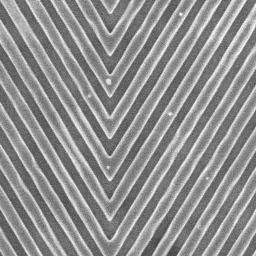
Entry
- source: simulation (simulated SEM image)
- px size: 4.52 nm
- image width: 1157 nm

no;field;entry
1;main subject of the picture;groups of lines, slits or small figures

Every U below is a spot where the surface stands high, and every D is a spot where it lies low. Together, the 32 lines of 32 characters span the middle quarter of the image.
UUUUDDUUUUDDDUUUDDDUUUUDDDUUUDDD
DUUUDDDUUUUDDUUUDDDUUUDDDUUUUDDU
DDUUUDDDUUUDUUUDDDUUUUDDDUUUDDDU
DDUUUUDDDUUUUUUDDDUUUDDDUUUDDDUU
DDDUUUDDDUUUUUDDDUUUDDDUUUUDDUUU
DDDDUUUDDDUUUDDDUUUUDDDUUUDDDUUU
UDDDUUUDDDUUUDDDUUUDDDUUUDDDUUUU
UUDDUUUUDDDUDDDUUUDDDDUUUDDDUUUD
UUDDDUUUUDDDDDDUUUDDDUUUDDDUUUDD
UUUDDDUUUDDDDDUUUDDDUUUDDDDUUUDD
UUUUDDUUUUDDDUUUUDDDUUUDDDUUUDDD
DUUUDDDUUUDDDUUUDDDUUUDDDUUUUDDD
DUUUDDDDUUUDUUUDDDUUUUDDDUUUDDDU
DDUUUDDDUUUUUUUDDDUUUDDDUUUUDDUU
DDDUUUDDDUUUUUDDDUUUDDDUUUUDDDUU
DDDUUUDDDUUUUUDDDUUUDDDUUUDDDUUU
UDDDUUUDDDUUUDDDUUUDDDUUUUDDDUUU
UDDDUUUUDDDUDDDUUUUDDDUUUDDDUUUD
UDDDDUUUDDDUDDDUUUDDDUUUDDDDUUUD
UUDDDDUUUDDDDDUUUDDDUUUUDDDUUUDD
UUUDDDUUUDDDDUUUUDDDUUUDDDUUUDDD
DUUDDDDUUUDDDUUUDDDUUUUDDDUUUDDD
DUUUDDDUUUUDUUUUDDUUUUDDDUUUDDDU
DDUUUDDDUUUUUUUDDDUUUDDDUUUDDDDU
DDUUUDDDDUUUUUUDDUUUUDDDUUUDDDUU
DDDUUUDDDUUUUUDDDUUUDDDUUUDDDUUU
DDDDUUUDDUUUUDDDUUUUDDDUUUDDDUUU
UDDDUUUDDDUUUDDUUUUDDDUUUDDDUUUU
UDDDDUUUDDDUDDDUUUDDDUUUDDDDUUUD
UUDDDUUUDDDDDDUUUUDDDUUUDDDUUUUD
UUUDDDUUUDDDDDUUUDDDUUUDDDDUUUDD
UUUDDDUUUDDDDUUUDDDDUUUDDDUUUDDD